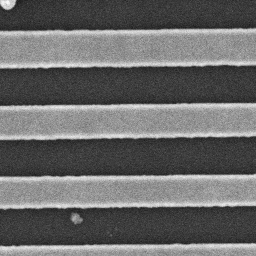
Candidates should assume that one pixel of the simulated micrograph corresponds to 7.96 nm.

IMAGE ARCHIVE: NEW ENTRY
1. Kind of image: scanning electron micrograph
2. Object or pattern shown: lines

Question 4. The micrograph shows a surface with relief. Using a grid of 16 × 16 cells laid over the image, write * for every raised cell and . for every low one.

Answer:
................
................
****************
****************
................
................
...........*****
****************
****************
................
................
****************
****************
................
................
****************